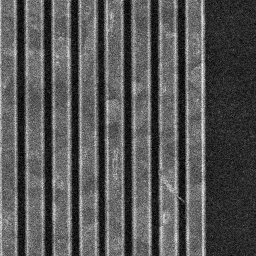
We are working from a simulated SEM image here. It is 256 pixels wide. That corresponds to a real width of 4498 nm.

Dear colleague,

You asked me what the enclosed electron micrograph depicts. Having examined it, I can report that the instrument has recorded parallel lines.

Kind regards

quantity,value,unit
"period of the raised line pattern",469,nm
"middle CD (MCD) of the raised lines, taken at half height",270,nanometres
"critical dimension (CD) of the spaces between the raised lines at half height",202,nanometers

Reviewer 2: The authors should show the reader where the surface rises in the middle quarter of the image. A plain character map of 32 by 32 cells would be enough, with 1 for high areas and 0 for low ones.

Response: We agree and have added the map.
10001111000111000011100011110001
10001111000111000011100011110001
10001111000111000011100011110001
10001111000111000011100011110001
10001111000111100011100011110001
10001111000111100011100011110001
10001111000111100011100011110001
10001111000111100011100011110001
10001111000111100011100011110001
10001111000111100011100011110001
10001111000111100011100011110001
10001111000111100011100011110001
10001111000111100011100011110001
10001111000111100011100011110001
10001111000111100011100011110001
10001111000111100011100011110001
10001111000111100011100011110001
10001111000111100011100011110001
10001111000111100011100011110001
10001111000111100011100011110001
10001111000111100011100011110001
10001111000111100011100011110001
10001111000111100011100011110001
10001111000111100011100011110001
10001111000111100011100011110001
10001111000111100011100011110001
10001111000111100011100011110001
10001111000111100011100011110001
10001111000111100011100011110001
10001111000111100011100011110001
10001111000111100011100011110001
10001111000111100011100011110001